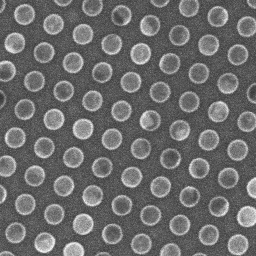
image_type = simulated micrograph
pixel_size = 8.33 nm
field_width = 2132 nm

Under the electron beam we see a regular array of raised bodies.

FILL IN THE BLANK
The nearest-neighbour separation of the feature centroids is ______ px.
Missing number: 29.9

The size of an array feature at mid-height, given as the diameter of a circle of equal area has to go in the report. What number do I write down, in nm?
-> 164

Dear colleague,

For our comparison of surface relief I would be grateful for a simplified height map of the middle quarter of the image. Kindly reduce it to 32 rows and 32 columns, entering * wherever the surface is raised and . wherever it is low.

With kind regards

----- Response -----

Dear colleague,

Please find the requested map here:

*****...***.............*****...
.***...*****.............***....
.......*****....**.............*
.......****....****.............
*........*....*****.............
**............*****...****......
**.............***....****......
**....***.............****....**
**...****.............****...***
.....****.....*..............***
.....****...****.............***
......**....*****.............**
............*****...***.........
.............***...*****........
...****............*****....**..
..*****............*****...****.
..*****....**........*.....****.
...****...****.............****.
....**....****.............***..
..........****....***...........
..........***....*****..........
.***.............*****....**....
*****............****...*****...
*****.............**....*****...
****....****............*****...
.**....*****.............***....
.......*****...****............*
........***....****.............
*..............****....**.......
**.............****...****......
**.....*........**....*****.....
**...****.............****....**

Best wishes